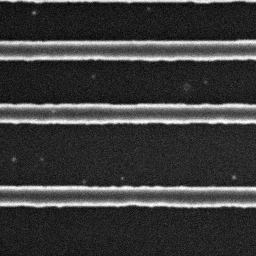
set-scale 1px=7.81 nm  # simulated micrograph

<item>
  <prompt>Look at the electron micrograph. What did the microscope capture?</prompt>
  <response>lines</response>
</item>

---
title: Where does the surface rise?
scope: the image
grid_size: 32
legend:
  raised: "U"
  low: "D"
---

DDDDDDDDDDDDDDDDDDDDDDDDDDDDDDDD
DDDDDDDDDDDDDDDDDDDDDDDDDDDDDDDD
DDDDDDDDDDDDDDDDDDDDDDDDDDDDDDDD
DDDDDDDDDDDDDDDDDDDDDDDDDDDDDDDD
DDDDDDDDDDDDDDDDDDDDDDDDDDDDDDDD
UUUUUUUUUUUUUUUUUUUUUUUUUUUUUUUU
UUUUUUUUUUUUUUUUUUUUUUUUUUUUUUUU
DDDDDDDDDDDDDDDDDDUUUUDDDUDDDDDD
DDDDDDDDDDDDDDDDDDDDDDDDDDDDDDDD
DDDDDDDDDDDDDDDDDDDDDDDDDDDDDDDD
DDDDDDDDDDDDDDDDDDDDDDDDDDDDDDDD
DDDDDDDDDDDDDDDDDDDDDDDDDDDDDDDD
DDDDDDDDDDDDDDDDDDDDDDDDDDDDDDDD
UUUUUUUUUUUUUUUUUUUUUUUUUUUUUUUU
UUUUUUUUUUUUUUUUUUUUUUUUUUUUUUUU
DDDDDDDDDDDDDDDDDDDDDDDDDDDDDDDD
DDDDDDDDDDDDDDDDDDDDDDDDDDDDDDDD
DDDDDDDDDDDDDDDDDDDDDDDDDDDDDDDD
DDDDDDDDDDDDDDDDDDDDDDDDDDDDDDDD
DDDDDDDDDDDDDDDDDDDDDDDDDDDDDDDD
DDDDDDDDDDDDDDDDDDDDDDDDDDDDDDDD
DDDDDDDDDDDDDDDDDDDDDDDDDDDDDDDD
DDDDDDDDDDDDDDDDDDDDDDDDDDDDDDDD
UUUUUUUUUUUUUUUUUUUUUUUUUUUUUUUU
UUUUUUUUUUUUUUUUUUUUUUUUUUUUUUUU
UUUUUUUUUUUUUUUUUUUUUUUUUUUUUUUU
DDDDDDDDDDDDDDDDDDDDDDDDDDDDDDDD
DDDDDDDDDDDDDDDDDDDDDDDDDDDDDDDD
DDDDDDDDDDDDDDDDDDDDDDDDDDDDDDDD
DDDDDDDDDDDDDDDDDDDDDDDDDDDDDDDD
DDDDDDDDDDDDDDDDDDDDDDDDDDDDDDDD
DDDDDDDDDDDDDDDDDDDDDDDDDDDDDDDD